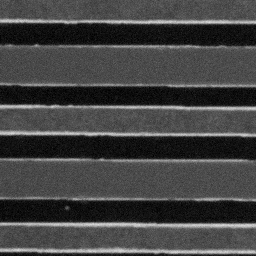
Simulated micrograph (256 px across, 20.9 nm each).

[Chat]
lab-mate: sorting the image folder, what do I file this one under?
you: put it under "lines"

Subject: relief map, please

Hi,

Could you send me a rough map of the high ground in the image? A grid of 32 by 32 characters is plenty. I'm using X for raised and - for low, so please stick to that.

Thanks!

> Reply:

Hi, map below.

XXXXXXXXXXXXXXXXXXXXXXXXXXXXXXXX
XXXXXXXXXXXXXXXXXXXXXXXXXXXXXXXX
XXXXXXXXXXXXXXXXXXXXXXXXXXXXXXXX
--------------------------------
--------------------------------
--------------------------------
XXXXXXXXXXXXXXXXXXXXXXXXXXXXXXXX
XXXXXXXXXXXXXXXXXXXXXXXXXXXXXXXX
XXXXXXXXXXXXXXXXXXXXXXXXXXXXXXXX
XXXXXXXXXXXXXXXXXXXXXXXXXXXXXXXX
XXXXXXXXXXXXXXXXXXXXXXXXXXXXXXXX
--------------------------------
--------------------------------
XXXXXXXXXXXXXXXXXXXXXXXXXXXXXXX-
XXXXXXXXXXXXXXXXXXXXXXXXXXXXXXXX
XXXXXXXXXXXXXXXXXXXXXXXXXXXXXXXX
XXXXXXXXXXXXXXXXXXXXXXXXXXXXXXXX
--------------------------------
--------------------------------
--------------------------------
XXXXXXXXXXXXXXXXXXXXXXXXXXXXXXXX
XXXXXXXXXXXXXXXXXXXXXXXXXXXXXXXX
XXXXXXXXXXXXXXXXXXXXXXXXXXXXXXXX
XXXXXXXXXXXXXXXXXXXXXXXXXXXXXXXX
XXXXXXXXXXXXXXXXXXXXXXXXXXXXXXXX
--------------------------------
--------------------------------
--------------------------------
XXXXXXXXXXXXXXXXXXXXXXXXXXXXXXXX
XXXXXXXXXXXXXXXXXXXXXXXXXXXXXXXX
XXXXXXXXXXXXXXXXXXXXXXXXXXXXXXXX
---------------XXXXXXXXXXXXXXXXX